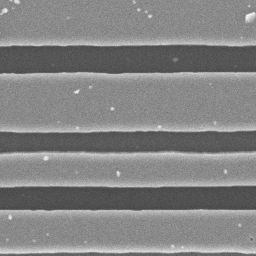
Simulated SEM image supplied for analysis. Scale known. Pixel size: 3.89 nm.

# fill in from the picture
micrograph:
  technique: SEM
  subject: lines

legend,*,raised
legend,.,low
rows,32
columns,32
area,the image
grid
********************************
********************************
********************************
********************************
********************************
**********************...*******
................................
................................
................................
********************************
********************************
********************************
********************************
********************************
********************************
********************************
.....*..........................
................................
................................
********************************
********************************
********************************
********************************
................................
................................
................................
********************************
********************************
********************************
********************************
********************************
*******.......**....**........**